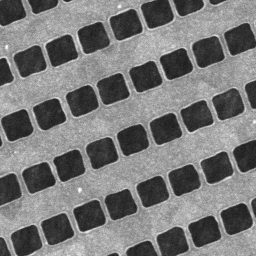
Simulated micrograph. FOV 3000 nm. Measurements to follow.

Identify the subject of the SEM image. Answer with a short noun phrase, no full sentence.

a regular array of holes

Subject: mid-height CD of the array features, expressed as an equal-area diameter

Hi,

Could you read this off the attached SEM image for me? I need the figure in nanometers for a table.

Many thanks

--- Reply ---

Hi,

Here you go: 362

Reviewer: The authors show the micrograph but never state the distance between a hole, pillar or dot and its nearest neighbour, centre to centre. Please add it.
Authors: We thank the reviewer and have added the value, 0.394 µm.